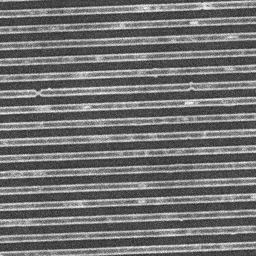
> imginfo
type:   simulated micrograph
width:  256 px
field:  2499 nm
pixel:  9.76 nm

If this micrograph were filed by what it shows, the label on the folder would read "parallel lines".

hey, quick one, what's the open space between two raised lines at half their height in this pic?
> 92.6 nanometres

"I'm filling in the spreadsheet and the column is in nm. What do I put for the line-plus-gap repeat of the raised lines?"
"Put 157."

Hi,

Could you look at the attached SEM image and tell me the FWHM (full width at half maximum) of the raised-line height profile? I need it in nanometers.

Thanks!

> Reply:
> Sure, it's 59.7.